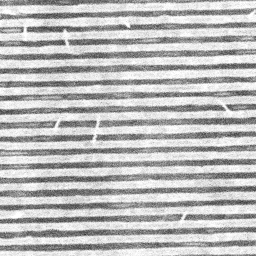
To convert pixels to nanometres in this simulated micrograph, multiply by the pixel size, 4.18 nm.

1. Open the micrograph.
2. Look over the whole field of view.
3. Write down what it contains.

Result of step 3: parallel lines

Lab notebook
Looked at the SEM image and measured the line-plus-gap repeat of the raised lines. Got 56.9 nm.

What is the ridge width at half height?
25.1 nm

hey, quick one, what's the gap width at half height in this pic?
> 0.0293 micrometres